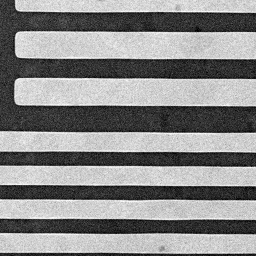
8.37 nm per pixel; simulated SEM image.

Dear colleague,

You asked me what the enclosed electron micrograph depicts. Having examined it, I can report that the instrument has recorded groups of lines, slits or small figures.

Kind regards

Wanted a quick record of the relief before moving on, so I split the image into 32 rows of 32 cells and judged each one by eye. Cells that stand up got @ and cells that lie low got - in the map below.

--@@@@@@@@@@@@@@@@@@@@@@@@@@@@@@
--------------------------------
--------------------------------
--------------------------------
--@@@@@@@@@@@@@@@@@@@@@@@@@@@@@@
--@@@@@@@@@@@@@@@@@@@@@@@@@@@@@@
--@@@@@@@@@@@@@@@@@@@@@@@@@@@@@@
--------------------------------
--------------------------------
--------------------------------
--@@@@@@@@@@@@@@@@@@@@@@@@@@@@@@
--@@@@@@@@@@@@@@@@@@@@@@@@@@@@@@
--@@@@@@@@@@@@@@@@@@@@@@@@@@@@@@
--------------------------------
--------------------------------
--------------------------------
--------------------------------
@@@@@@@@@@@@@@@@@@@@@@@@@@@@@@@@
@@@@@@@@@@@@@@@@@@@@@@@@@@@@@@@@
--------------------------------
--------------------------------
@@@@@@@@@@@@@@@@@@@@@@@@@@@@@@@@
@@@@@@@@@@@@@@@@@@@@@@@@@@@@@@@@
--------------------------------
--------------------------------
@@@@@@@@@@@@@@@@@@@@@@@@@@@@@@@@
@@@@@@@@@@@@@@@@@@@@@@@@@@@@@@@@
--------------------------------
--------------------------------
@@@@@@@@@@@@@@@@@@@@@@@@@@@@@@@@
@@@@@@@@@@@@@@@@@@@@@@@@@@@@@@@@
@@@@@@@@@@@@@@@@@@@@@@@@@@@@@@@@